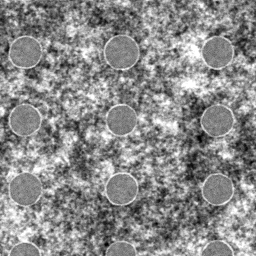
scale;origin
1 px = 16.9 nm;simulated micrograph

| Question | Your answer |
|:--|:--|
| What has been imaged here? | a regular array of raised bodies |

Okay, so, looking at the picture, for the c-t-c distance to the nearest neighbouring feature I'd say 1150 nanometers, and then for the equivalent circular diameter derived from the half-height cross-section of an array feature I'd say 552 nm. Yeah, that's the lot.